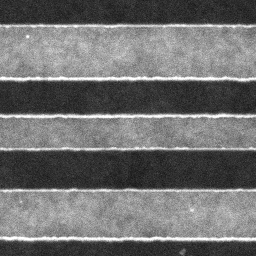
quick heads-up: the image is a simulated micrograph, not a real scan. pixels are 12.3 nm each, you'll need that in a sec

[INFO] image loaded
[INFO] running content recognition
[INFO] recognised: lines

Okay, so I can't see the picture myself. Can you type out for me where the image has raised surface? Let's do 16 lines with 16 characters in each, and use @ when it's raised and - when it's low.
@@@@@@@@@@@@@@@@
@@@@@@@@@@@@@@@@
----------------
----------------
----------------
@@@@@@@@@@@@@@@@
@@@@@@@@@@@@@@@@
----------------
----------------
@@@@@@@@@@@@@@@@
@@@@@@@@@@@@@@@@
@@@@@@@@@@@@@@@@
----------------
----------------
----------------
@@@@@@@@@@@@@@@@